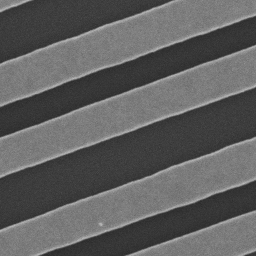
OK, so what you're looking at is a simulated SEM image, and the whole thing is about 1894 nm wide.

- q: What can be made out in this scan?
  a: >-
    lines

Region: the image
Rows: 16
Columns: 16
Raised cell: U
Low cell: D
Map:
UDDDDDDDDDUUUUUU
DDDDDDDUUUUUUUUD
DDDDUUUUUUUUDDDD
DUUUUUUUUDDDDDUU
UUUUUUDDDDDUUUUU
UUUDDDDDDUUUUUUU
DDDDDDUUUUUUUDDD
DDDUUUUUUUDDDDDD
UUUUUUUDDDDDDDDD
UUUUDDDDDDDDDUUU
UUDDDDDDDDDUUUUU
DDDDDDDDUUUUUUUD
DDDDDUUUUUUUUDDD
DDUUUUUUUDDDDDDU
UUUUUUUDDDDDUUUU
UUUUDDDDDUUUUUUU